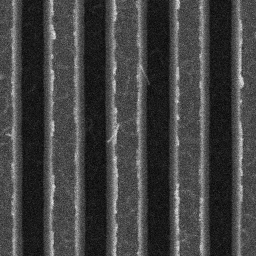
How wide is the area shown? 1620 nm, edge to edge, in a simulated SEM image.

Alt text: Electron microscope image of parallel lines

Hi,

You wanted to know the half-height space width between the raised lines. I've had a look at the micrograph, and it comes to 187 nanometres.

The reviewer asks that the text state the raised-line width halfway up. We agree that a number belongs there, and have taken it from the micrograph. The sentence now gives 33 px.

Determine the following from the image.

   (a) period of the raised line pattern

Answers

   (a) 397 nm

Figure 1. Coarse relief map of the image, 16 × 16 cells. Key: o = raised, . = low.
o..oo..oo..oo..o
o..oo..oo..oo..o
o..oo..oo..oo..o
o..oo..oo..oo..o
o..oo..oo..oo..o
o..oo..oo..oo..o
o..oo..oo..oo..o
o..oo..oo..oo..o
o..oo..oo..oo..o
o..oo..oo..oo..o
o..oo..oo..oo..o
o..oo..oo..oo..o
o..oo..oo..oo..o
o..oo..oo..oo..o
o..oo..oo..oo..o
o..oo..oo..oo..o